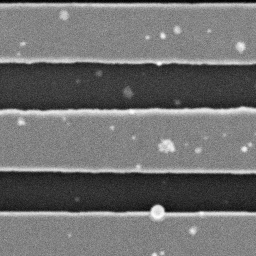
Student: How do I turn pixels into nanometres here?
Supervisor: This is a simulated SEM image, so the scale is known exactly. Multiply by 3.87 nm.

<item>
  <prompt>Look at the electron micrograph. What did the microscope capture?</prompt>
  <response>lines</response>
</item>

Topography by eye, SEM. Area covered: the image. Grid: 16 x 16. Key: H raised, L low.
HHHHHHHHHHHHHHHH
HHHHHHHHHHHHHHHH
HHHHHHHHHHHHHHHH
HHHHHHHHHHHHHHHH
LLLLLLLLLLLLLLLL
LLLLLLLLLLLLLLLL
LLLLLLLLLLLLLLLL
HHHHHHHHHHHHHHHH
HHHHHHHHHHHHHHHH
HHHHHHHHHHHHHHHH
HHHHHHHHHHHHHHHH
LLLLLLLLLLLLLLLL
LLLLLLLLLLLLLLLL
HHHHHHHHHHHHHHHH
HHHHHHHHHHHHHHHH
HHHHHHHHHHHHHHHH